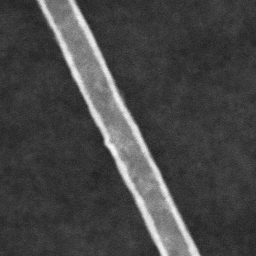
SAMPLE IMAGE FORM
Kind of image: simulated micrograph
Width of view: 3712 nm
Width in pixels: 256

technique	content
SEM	one or a few lines or trenches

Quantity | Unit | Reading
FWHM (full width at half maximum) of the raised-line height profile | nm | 412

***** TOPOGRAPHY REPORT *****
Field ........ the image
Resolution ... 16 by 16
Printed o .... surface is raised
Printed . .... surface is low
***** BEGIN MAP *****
...oo...........
...oo...........
....oo..........
....oo..........
.....oo.........
.....oo.........
......oo........
......oo........
.......oo.......
.......oo.......
........oo......
........oo......
.........oo.....
.........oo.....
..........oo....
..........oo....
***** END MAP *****